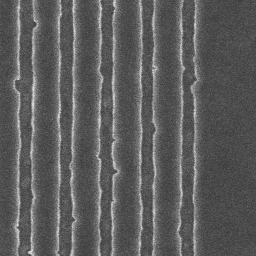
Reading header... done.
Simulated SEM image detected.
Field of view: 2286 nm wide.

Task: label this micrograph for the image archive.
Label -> parallel lines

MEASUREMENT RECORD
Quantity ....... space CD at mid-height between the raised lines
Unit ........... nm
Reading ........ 116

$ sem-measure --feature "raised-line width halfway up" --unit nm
248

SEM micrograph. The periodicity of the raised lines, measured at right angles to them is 362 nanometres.